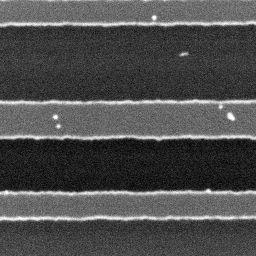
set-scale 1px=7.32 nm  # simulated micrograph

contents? lines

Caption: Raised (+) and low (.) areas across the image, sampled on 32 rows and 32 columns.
++++++++++++++++++++++++++++++++
++++++++++++++++++++++++++++++++
++++++++++++++++++++++++++++++++
................................
................................
................................
................................
................................
................................
................................
................................
................................
................................
++++++++++++++++++++++++++++++++
++++++++++++++++++++++++++++++++
++++++++++++++++++++++++++++++++
++++++++++++++++++++++++++++++++
................................
................................
................................
................................
................................
................................
................................
++++++++++++++++++++++++++++++++
++++++++++++++++++++++++++++++++
++++++++++++++++++++++++++++++++
................................
................................
................................
................................
................................